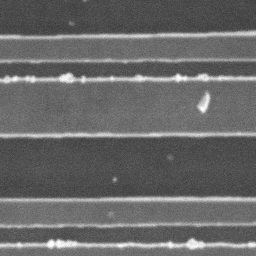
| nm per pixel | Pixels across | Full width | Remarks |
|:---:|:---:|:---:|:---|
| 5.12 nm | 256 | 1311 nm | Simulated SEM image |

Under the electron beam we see lines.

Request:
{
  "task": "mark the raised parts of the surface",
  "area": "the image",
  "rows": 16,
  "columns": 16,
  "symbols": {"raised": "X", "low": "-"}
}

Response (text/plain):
----------------
----------------
XXXXXXXXXXXXXXXX
XXXXXXXXXXXXXXXX
XXXXXXXXXXXXXXXX
XXXXXXXXXXXXXXXX
XXXXXXXXXXXXXXXX
XXXXXXXXXXXXXXXX
----------------
----------------
----------------
----------------
---X--XXXXXXXXXX
XXXXXXXXXXXXXXXX
XXXXXXXXXXXXXXXX
XXXXXXXXXXXXXXXX